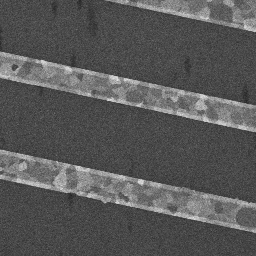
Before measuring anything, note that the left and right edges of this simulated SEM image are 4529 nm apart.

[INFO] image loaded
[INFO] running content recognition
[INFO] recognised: one or a few lines or trenches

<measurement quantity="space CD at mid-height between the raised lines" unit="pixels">73.8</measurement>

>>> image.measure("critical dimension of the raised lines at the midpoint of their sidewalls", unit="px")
23.1